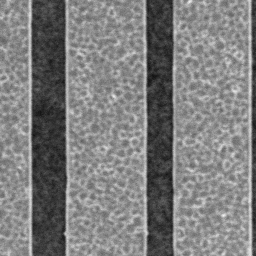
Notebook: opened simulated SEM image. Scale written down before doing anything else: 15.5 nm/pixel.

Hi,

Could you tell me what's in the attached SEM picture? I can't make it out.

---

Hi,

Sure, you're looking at one or a few lines or trenches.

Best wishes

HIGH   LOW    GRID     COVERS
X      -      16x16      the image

XX--XXXXX--XXXXX
XX--XXXXX--XXXXX
XX--XXXXX--XXXXX
XX--XXXXX--XXXXX
XX--XXXXX--XXXXX
XX--XXXXX--XXXXX
XX--XXXXX--XXXXX
XX--XXXXX--XXXXX
XX--XXXXX--XXXXX
XX--XXXXX--XXXXX
XX--XXXXX--XXXXX
XX--XXXXX--XXXXX
XX--XXXXX--XXXXX
XX--XXXXX--XXXXX
XX--XXXXX--XXXXX
XX--XXXXX--XXXXX